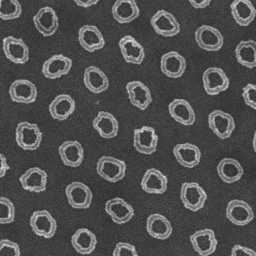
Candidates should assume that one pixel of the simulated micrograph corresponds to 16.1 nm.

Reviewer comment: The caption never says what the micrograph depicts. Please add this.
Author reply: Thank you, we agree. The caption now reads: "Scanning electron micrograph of a regular array of ring-shaped raised bodies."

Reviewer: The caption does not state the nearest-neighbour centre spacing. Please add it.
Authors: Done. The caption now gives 675 nanometers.